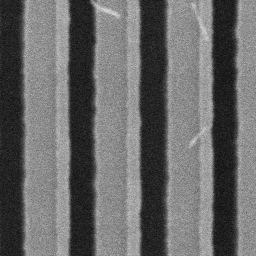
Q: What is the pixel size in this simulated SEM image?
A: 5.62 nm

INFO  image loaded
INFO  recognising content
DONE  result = lines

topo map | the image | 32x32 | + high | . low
...++++++...+++++....+++++....++
...++++++...+++++....++++++...++
...++++++...+++++....+++++....++
...++++++...+++++....+++++....++
...++++++...+++++....+++++....++
...++++++...+++++....+++++....++
...++++++...+++++....+++++....++
...++++++...+++++....+++++....++
...+++++....+++++....+++++....++
...++++++...+++++....++++++...++
...+++++....+++++....++++++...++
...++++++...+++++....+++++....++
...++++++...+++++....++++++...++
...++++++...+++++....++++++...++
...++++++...+++++....++++++...++
...++++++...++++++...+++++....++
...++++++...+++++....+++++....++
...++++++...+++++....+++++....++
...++++++...+++++....++++++...++
...++++++...+++++....++++++...++
...++++++...+++++....++++++...++
...++++++...+++++....++++++...++
...++++++...++++++...++++++...++
...++++++...++++++...++++++...++
...++++++...++++++...++++++...++
...++++++...++++++...++++++...++
...++++++...+++++....++++++...++
...++++++...+++++....++++++...++
...++++++...+++++....+++++....++
...++++++...++++++...+++++....++
...++++++...+++++....+++++....++
...++++++...+++++....++++++...++